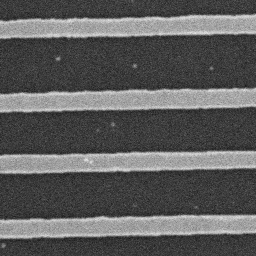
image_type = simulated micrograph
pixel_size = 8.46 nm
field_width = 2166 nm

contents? lines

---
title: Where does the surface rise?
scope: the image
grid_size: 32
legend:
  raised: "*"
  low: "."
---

................................
................................
....*....***...*****************
********************************
************....................
................................
................................
................................
................................
................................
................................
...............*****************
********************************
*************************.......
................................
................................
................................
................................
................................
.****.*.************************
********************************
********........................
................................
................................
................................
................................
................................
....*..*************************
********************************
**********.*....................
................................
................................